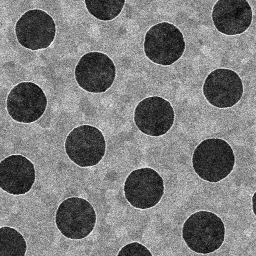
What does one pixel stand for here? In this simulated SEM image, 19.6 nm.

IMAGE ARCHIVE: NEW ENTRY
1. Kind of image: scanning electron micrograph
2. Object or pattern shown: a regular array of holes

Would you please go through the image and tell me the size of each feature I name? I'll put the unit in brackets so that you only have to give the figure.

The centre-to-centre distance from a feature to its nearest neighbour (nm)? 1430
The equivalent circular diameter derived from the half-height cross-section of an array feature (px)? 41.4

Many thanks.